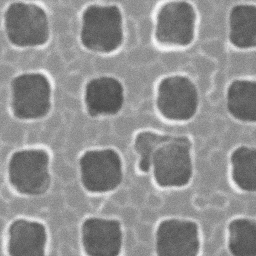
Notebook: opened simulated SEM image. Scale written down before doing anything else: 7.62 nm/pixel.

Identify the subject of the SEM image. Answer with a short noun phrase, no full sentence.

a regular array of holes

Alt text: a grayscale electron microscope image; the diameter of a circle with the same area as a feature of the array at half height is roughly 0.356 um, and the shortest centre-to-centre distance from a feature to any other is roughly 68.2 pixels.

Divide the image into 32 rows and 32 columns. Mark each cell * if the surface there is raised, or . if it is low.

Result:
*...****************....********
*.....****.....*****.....****...
*.....****.....*****.....****...
*.....****.....*****....*****...
*.....****.....****.....*****...
*.....****.....*****....*****...
************..******************
********************************
********************************
**....***************..*********
*.....*****....*****....*****...
*.....*****....*****.....***....
*.....*****....****......***....
*.....*****....*****.....***....
**....*****.********....*****...
********************************
******************.*************
*****************.......********
***...***********.......******..
*.....****.....**.......*****...
*.....****.....**.......*****...
*.....****.....****.....*****...
*.....****.....****.....*****...
*.....****....****************..
********************************
********************************
********************************
**.********....*****....*****...
*.....****.....*****.....****...
*.....****.....****......****...
*.....****.....****......****...
*.....*****....*****.....****...